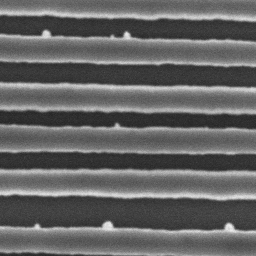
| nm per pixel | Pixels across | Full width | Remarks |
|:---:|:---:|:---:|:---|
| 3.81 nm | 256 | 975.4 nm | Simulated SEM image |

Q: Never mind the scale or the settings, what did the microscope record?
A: lines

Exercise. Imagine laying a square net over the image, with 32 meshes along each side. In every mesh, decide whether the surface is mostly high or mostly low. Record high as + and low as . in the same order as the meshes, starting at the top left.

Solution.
++++++++++++++++++++++++++++++++
++++++++++++++++++++++++++++++++
...............................+
................................
+++.............................
++++++++++++++++++++++++++++++++
++++++++++++++++++++++++++++++++
++++++++++++++++++++++++++++++++
................................
................................
................................
++++++++++++++++++++++++++++++++
++++++++++++++++++++++++++++++++
++++++++++++++++++++++++++++++++
................................
................................
++++++++++++++++++++++++++++++++
++++++++++++++++++++++++++++++++
++++++++++++++++++++++++++++++++
................................
................................
++++++++++++++++++++++++++..+++.
++++++++++++++++++++++++++++++++
++++++++++++++++++++++++++++++++
..............++++.+++++++++++++
................................
................................
................................
+++++.+++++++...................
++++++++++++++++++++++++++++++++
++++++++++++++++++++++++++++++++
+++.++++++++++++++++++++++++++++